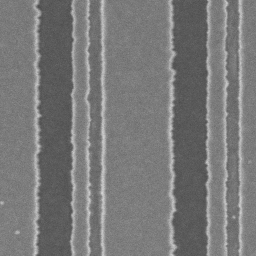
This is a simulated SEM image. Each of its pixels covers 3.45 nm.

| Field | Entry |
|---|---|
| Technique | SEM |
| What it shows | lines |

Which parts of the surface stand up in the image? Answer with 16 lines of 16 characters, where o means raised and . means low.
oo..ooooooo..ooo
oo...oooooo..ooo
oo...oooooo..ooo
oo...oooooo..ooo
oo...oooooo..ooo
oo...oooooo..ooo
oo...oooooo..ooo
oo...oooooo..ooo
oo..ooooooo..ooo
oo...oooooo..ooo
oo...oooooo..ooo
oo...oooooo..ooo
oo..ooooooo..ooo
oo...oooooo..ooo
oo...oooooo..ooo
oo..ooooooo..ooo